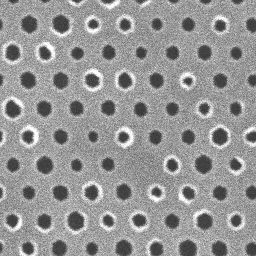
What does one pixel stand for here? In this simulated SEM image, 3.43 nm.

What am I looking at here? a regular array of holes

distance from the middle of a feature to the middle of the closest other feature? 108 nanometers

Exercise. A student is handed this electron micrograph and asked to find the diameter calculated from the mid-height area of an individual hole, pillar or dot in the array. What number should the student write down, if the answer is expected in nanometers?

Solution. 48.2